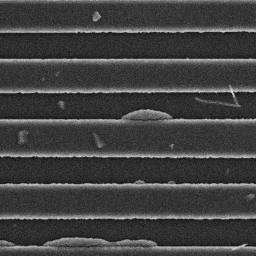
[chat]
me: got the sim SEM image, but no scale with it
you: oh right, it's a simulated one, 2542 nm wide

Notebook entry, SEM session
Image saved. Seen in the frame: lines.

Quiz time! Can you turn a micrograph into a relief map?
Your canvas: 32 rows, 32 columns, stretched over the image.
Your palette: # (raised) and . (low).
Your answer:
################################
################################
################################
################################
................................
................................
................................
################################
################################
################################
################################
##############....#..........#..
................................
................................
................#####...........
################################
################################
################################
################################
################################
................................
................................
................................
################################
################################
################################
################################
................................
................................
................................
#.....#######..####.............
################################